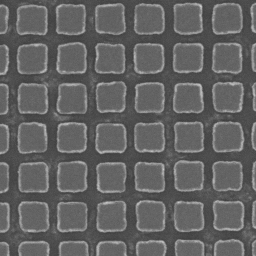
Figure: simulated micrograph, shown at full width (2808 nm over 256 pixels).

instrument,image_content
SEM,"a regular array of raised bodies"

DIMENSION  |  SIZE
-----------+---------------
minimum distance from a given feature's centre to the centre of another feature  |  424 nm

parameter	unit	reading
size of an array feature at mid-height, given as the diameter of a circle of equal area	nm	357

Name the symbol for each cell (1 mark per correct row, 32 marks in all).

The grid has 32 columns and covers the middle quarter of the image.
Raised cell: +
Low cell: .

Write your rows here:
+++++...+++++++...+++++++..+++++
+++++...+++++++...+++++++...++++
................................
................................
............+++.................
+++++...+++++++...+++++++...++++
++++++..+++++++...+++++++...++++
++++++..+++++++...+++++++...++++
++++++..+++++++...+++++++..+++++
++++++..+++++++...+++++++..+++++
++++++..+++++++...+++++++..+++++
++++++...++++++...+++++++...++++
................................
................................
................................
+++++...+++++++...+++++++...++++
++++++..+++++++...+++++++...++++
+++++...+++++++...+++++++...++++
++++++..++++++++..+++++++...++++
++++++..++++++++..+++++++...++++
+++++...++++++++..+++++++...++++
+++++...+++++++...+++++++...++++
................................
................................
.++++.......................+++.
+++++...+++++++...+++++++...++++
+++++...+++++++...+++++++...++++
+++++...+++++++...+++++++...++++
+++++...+++++++...+++++++...++++
+++++...+++++++...+++++++...++++
++++++..+++++++...+++++++...++++
+++++....++++++...+++++++....+++